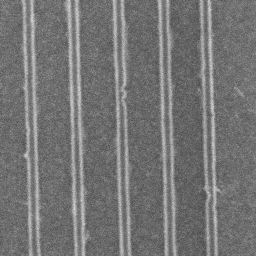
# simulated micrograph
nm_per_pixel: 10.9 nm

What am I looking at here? parallel lines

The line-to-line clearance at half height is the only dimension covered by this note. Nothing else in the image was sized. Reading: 0.403 µm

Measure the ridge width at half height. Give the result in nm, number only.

90.9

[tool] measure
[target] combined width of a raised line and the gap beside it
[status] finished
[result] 482 nm